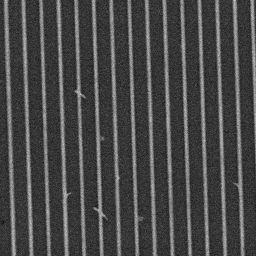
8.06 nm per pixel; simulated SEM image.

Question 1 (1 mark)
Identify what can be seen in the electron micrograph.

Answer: parallel lines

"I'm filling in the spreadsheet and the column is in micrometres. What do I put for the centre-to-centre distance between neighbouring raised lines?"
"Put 0.142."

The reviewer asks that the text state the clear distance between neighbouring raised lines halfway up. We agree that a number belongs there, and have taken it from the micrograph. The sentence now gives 116 nanometers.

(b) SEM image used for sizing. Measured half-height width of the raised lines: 0.0272 micrometres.